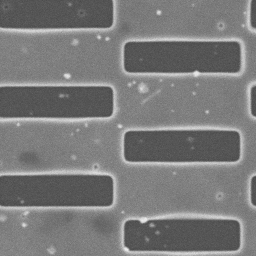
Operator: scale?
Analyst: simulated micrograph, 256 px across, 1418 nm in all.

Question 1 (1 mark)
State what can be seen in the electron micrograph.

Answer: groups of lines, slits or small figures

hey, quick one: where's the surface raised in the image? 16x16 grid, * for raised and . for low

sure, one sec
.......*********
.......*********
****************
********.......*
********.......*
.......*********
.......*********
****************
********.......*
********.......*
****************
.......*********
.......*********
****************
********.......*
********.......*